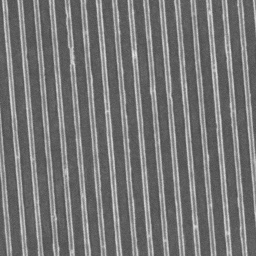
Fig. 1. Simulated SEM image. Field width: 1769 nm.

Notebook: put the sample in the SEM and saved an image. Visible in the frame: parallel lines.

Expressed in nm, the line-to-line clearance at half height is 76.5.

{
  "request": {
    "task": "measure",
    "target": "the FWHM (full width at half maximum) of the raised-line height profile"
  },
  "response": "0.0292 microns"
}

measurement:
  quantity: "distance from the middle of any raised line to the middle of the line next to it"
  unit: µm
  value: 0.108